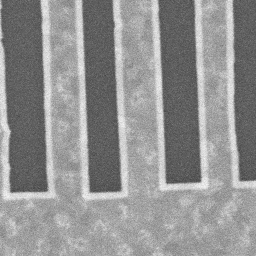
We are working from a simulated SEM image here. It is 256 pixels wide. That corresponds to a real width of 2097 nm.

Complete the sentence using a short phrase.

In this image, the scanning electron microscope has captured one or a few lines or trenches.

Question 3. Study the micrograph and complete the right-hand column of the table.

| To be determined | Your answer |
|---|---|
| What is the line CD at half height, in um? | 0.294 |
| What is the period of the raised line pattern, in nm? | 621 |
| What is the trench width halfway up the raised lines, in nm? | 341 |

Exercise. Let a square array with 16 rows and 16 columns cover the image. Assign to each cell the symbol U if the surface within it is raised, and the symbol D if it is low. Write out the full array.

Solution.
DDDUUDDUUUDDUUDD
DDDUUDDUUUDDUUDD
DDDUUDDUUUDDUUDD
DDDUUDDUUUDDUUDD
DDDUUDDUUUDDDUDD
DDDUUDDUUUDDDUDD
DDDUUDDDUUDDDUDD
DDDUUDDDUUDDDUDD
DDDUUDDDUUDDDUUD
DDDUUDDDUUDDDUUD
DDDUUDDDUUDDDUUD
DDDUUDDDUUDDUUUD
UUUUUUUUUUUUUUUU
UUUUUUUUUUUUUUUU
UUUUUUUUUUUUUUUU
UUUUUUUUUUUUUUUU